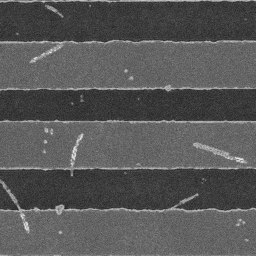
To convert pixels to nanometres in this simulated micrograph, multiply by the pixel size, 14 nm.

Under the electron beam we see lines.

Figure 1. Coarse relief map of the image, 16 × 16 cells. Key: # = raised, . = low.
................
................
................
################
################
################
................
................
################
################
###########.####
................
................
################
################
################